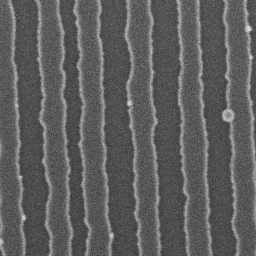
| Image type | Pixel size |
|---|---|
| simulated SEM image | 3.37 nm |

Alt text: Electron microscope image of lines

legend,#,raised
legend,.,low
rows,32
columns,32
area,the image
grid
#....##..####...###...###...###.
##...##..####...###...###...###.
##...###..##....###...###...###.
##...###..##....###...###...###.
##...###..##....###...###...###.
##...###..###...###...###...###.
##...###..###...###....##...###.
##...###..###...###...###...###.
##...###..###...###....##...###.
##...###..###...###...###...###.
##...###..###...###...###...###.
##...###..###...###...###...###.
##...###..###...###...###...###.
##...###..###...###...###...###.
##...###..###...###....##...####
##...###..###...###....###...###
##...###..###...###....###...###
##...###..###....##....###...###
##...###..###....##....###...###
##...###..###....##....###...###
##...####.###....###...###...###
##....###.###....###...###...###
###...###.###....###...###...###
###...###.###....###...###...###
###...###.###....###...###...###
###...###..##....###...###...###
###...###..##....###...###...###
###...###..###...###...###...###
###...###..###...###...###...###
###...###..###...###...###...###
###...###..###...###...###....##
###...###..###...###...###....##